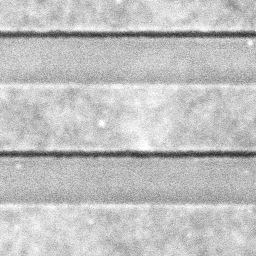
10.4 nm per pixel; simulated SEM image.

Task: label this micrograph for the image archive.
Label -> lines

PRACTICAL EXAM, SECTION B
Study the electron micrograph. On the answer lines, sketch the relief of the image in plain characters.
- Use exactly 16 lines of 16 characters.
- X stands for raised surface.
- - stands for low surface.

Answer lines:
XXXXXXXXXXXXXXXX
XXXXXXXXXXXXXXXX
----------------
----------------
----------------
XXXXXXXXXXXXXXXX
XXXXXXXXXXXXXXXX
XXXXXXXXXXXXXXXX
XXXXXXXXXXXXXXXX
----------------
----------------
----------------
----------------
XXXXXXXXXXXXXXXX
XXXXXXXXXXXXXXXX
XXXXXXXXXXXXXXXX